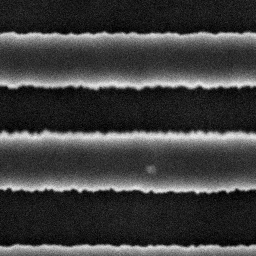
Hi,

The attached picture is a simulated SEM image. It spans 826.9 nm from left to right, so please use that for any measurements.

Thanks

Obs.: lines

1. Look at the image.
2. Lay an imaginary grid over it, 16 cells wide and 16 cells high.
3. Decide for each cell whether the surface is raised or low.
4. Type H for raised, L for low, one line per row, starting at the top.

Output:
LLLLLLLLLLLLLLLL
LLLLLLLLLLLLLLLL
HHHHHHHHHHHHHHHH
HHHHHHHHHHHHHHHH
HHHHHHHHHHHHHHHH
LLLLLLLLLLLLLLLL
LLLLLLLLLLLLLLLL
LLLLLLLLLLLLLLLL
HHHHHLHHHHHHHHHH
HHHHHHHHHHHHHHHH
HHHHHHHHHHHHHHHH
HHHHHHHHHHHHHHHH
LLLLLLLLLLLLLLLL
LLLLLLLLLLLLLLLL
LLLLLLLLLLLLLLLL
HHHHHHHHHHHHHHHH